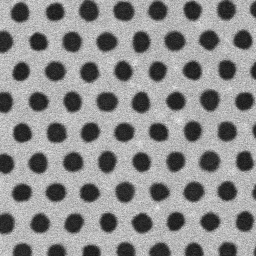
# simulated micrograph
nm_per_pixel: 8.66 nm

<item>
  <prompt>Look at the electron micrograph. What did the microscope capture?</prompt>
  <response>a regular array of holes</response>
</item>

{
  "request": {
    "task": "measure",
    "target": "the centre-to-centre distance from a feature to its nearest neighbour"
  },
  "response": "293 nanometres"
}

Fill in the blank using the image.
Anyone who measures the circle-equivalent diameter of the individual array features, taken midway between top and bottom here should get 166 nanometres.